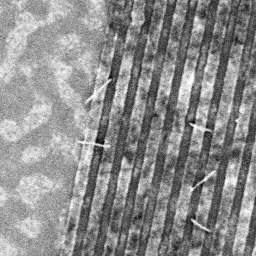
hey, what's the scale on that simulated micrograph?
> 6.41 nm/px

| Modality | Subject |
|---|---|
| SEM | parallel lines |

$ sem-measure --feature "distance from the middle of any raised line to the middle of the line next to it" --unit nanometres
134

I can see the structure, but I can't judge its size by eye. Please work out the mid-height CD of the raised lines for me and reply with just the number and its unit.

69.8 nanometres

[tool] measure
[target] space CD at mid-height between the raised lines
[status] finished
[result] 64.3 nm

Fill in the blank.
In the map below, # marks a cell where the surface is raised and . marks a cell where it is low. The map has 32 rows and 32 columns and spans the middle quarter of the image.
.........###..###...##...###..##
#........##...###..###...##...##
#.......###...###..###...##...##
........###...##...###..###...##
........###..###...##...###..###
........###..###...##...###..###
........##...###..###...##...###
.......###...##...###..###...###
.......###...##...###..###...##.
.......###..###...##...###..###.
.......###..###..###...###..###.
.......##...###..###...##...###.
......###...###..###..###...##..
......###...##...###..###...##..
......###..###...##...###..###..
......##...###..###...###..###..
......##...###..###...###..###..
.....###...###..###..###...###..
.....###..###...###..###..###...
.....###..###...##...###..###...
.....###..###..###...###..###...
.....##...###..###...##...###..#
.....##...###..###..###...###..#
....###..###...###..###...##...#
....###..###...##...###..###...#
....##...###..###...###..###..##
....##...###..###...##...###..##
...###...##...###..###...##...##
...###..###...##...###...##...##
...###..###...##...###..###...##
...##...###..###...##...###..###
..###...###..###..###...###..###